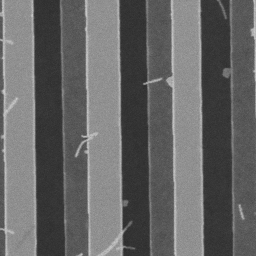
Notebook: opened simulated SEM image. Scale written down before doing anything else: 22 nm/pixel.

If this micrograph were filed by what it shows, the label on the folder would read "lines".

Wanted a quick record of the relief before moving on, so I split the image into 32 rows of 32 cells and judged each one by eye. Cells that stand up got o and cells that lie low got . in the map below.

oooo....ooooooo...ooooooo....ooo
oooo....ooooooo...ooooooo....ooo
oooo....ooooooo...ooooooo....ooo
oooo....ooooooo...ooooooo....ooo
oooo....ooooooo...ooooooo....ooo
oooo....ooooooo...ooooooo....ooo
oooo....ooooooo....oooooo....ooo
oooo....ooooooo....oooooo....ooo
oooo....ooooooo....oooooo....ooo
oooo....ooooooo....oooooo....ooo
oooo....ooooooo...ooooooo....ooo
oooo....ooooooo....oooooo....ooo
oooo....ooooooo....oooooo....ooo
oooo....ooooooo....oooooo....ooo
oooo....ooooooo....oooooo....ooo
oooo....ooooooo....oooooo....ooo
oooo....ooooooo....oooooo....ooo
oooo....ooooooo....oooooo....ooo
oooo....ooooooo....oooooo....ooo
oooo....ooooooo....oooooo....ooo
oooo....ooooooo....oooooo....ooo
oooo....ooooooo....oooooo....ooo
oooo....ooooooo....oooooo....ooo
oooo....ooooooo....oooooo....ooo
oooo....ooooooo....oooooo....ooo
oooo....ooooooo....oooooo....ooo
oooo....ooooooo....oooooo....ooo
oooo....ooooooo....oooooo....ooo
ooooo...ooooooo....oooooo....ooo
ooooo...ooooooo....oooooo....ooo
ooooo...ooooooo....oooooo....ooo
oooo....ooooooo....oooooo....ooo